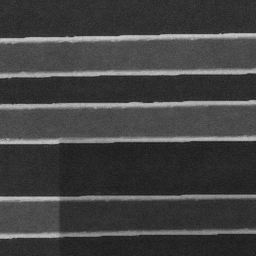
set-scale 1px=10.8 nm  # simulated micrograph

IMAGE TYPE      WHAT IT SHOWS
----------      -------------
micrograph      lines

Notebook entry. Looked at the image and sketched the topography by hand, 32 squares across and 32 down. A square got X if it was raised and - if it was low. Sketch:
--------------------------------
--------------------------------
--------------------------------
--------------------------------
-------------------XXXXXXXXXXXXX
XXXXXXXXXXXXXXXXXXXXXXXXXXXXXXXX
XXXXXXXXXXXXXXXXXXXXXXXXXXXXXXXX
XXXXXXXXXXXXXXXXXXXXXXXXXXXXXXXX
XXXXXXXXXXXXXXXXXXXXXXXXXXXXXXXX
XXX-----------------------------
--------------------------------
--------------------------------
--------------------------------
XXXXXXXXXXXXXXXXXXXXXXXXXXXXXXXX
XXXXXXXXXXXXXXXXXXXXXXXXXXXXXXXX
XXXXXXXXXXXXXXXXXXXXXXXXXXXXXXXX
XXXXXXXXXXXXXXXXXXXXXXXXXXXXXXXX
XXXXXXXXXXXXXXXXXXXXXXXXX-------
--------------------------------
--------------------------------
--------------------------------
--------------------------------
--------------------------------
--------------------------------
------------------------------XX
XXXXXXXXXXXXXXXXXXXXXXXXXXXXXXXX
XXXXXXXXXXXXXXXXXXXXXXXXXXXXXXXX
XXXXXXXXXXXXXXXXXXXXXXXXXXXXXXXX
XXXXXXXXXXXXXXXXXXXXXXXXXXXXXXXX
XXXXXXXXX-----------------------
--------------------------------
--------------------------------